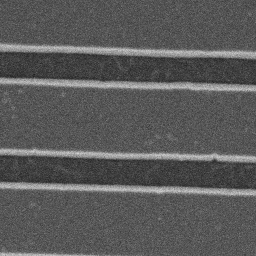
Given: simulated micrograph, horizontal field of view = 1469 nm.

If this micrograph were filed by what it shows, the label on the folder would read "one or a few lines or trenches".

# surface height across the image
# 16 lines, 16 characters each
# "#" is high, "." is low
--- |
################
################
################
................
................
################
################
################
################
################
................
................
################
################
################
################